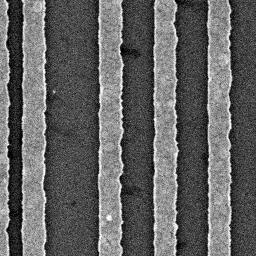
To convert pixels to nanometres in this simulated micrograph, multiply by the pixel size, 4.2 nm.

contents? lines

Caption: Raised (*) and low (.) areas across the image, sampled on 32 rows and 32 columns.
*..***......***....***....***...
*..***......***....***....***...
*..**.......***....***....***...
*..**.......***....***....***...
*..***......***....***....***...
*..***......***....***....***...
*..***......***....***....***...
*..***......***....***....***...
*..***......***....***....***...
*..***......***....***....***...
*..***......***....***....***...
*..***......***....***....***...
*..***......***....***....***...
*..***......***....***....***...
*..***......***....***....***...
*..***......***....***....***...
*..***......***.....**....***...
*..***......***....***....***...
*..***......***....***....***...
*..**.......***....***....***...
*..***......***....***....***...
*..***......***....***....***...
*..**.......***....***....***...
*..**.......***....***....***...
*..***......***....***....***...
*..***......***....***....***...
*..***......***....***....***...
*..***......***....***....***...
*..***......***....***....***...
*..***......***....***....***...
*..***......***....***....***...
*..***......***....***....***...